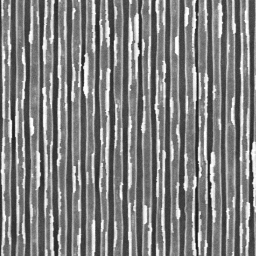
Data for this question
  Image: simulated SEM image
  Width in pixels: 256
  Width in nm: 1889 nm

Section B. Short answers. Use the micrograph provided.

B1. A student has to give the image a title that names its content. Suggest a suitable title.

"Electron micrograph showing parallel lines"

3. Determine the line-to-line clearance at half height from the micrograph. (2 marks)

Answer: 43.4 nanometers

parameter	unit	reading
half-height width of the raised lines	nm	62.7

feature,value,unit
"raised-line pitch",104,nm